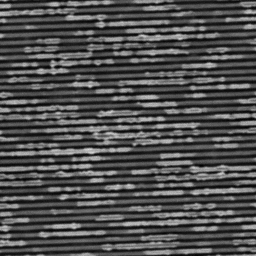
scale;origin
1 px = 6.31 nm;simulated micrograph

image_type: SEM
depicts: parallel lines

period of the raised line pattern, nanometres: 46.8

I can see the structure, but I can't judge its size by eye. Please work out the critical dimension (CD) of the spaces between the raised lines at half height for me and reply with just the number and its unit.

26 nm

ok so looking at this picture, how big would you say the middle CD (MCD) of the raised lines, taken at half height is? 21.3 nm